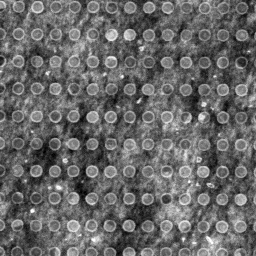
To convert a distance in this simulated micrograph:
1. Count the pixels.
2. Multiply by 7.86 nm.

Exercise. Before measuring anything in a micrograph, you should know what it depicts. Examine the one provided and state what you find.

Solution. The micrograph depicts a regular array of raised bodies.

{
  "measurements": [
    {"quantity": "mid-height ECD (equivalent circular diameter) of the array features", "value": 90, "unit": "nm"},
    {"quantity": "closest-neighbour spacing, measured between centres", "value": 145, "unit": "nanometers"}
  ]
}